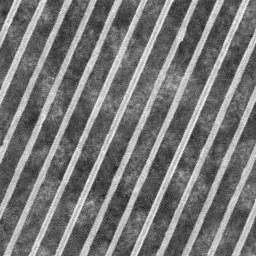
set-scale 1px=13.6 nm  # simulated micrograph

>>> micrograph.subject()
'parallel lines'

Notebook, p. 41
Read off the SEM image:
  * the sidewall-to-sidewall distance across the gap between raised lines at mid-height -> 247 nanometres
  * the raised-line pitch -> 315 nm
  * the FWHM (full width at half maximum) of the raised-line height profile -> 66.9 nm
